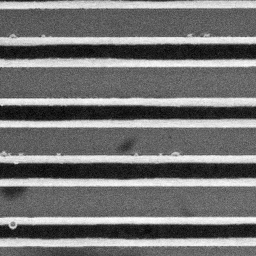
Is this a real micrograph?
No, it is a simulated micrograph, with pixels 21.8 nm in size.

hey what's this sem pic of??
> lines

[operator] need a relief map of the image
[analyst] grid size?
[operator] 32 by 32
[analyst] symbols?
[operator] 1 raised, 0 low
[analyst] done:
11111111111111111111111111110001
00000000000000000000000000000000
00000000000000000000000000000000
00000000000000000000000000000000
00000000000000000000000000000000
11111111111111111111111111111111
11111111111111111111111111111111
11111111111111111111111111111111
00000000000000000000000000000000
00000000000000000000000000000000
00000000000000000000000000000000
00000000000000000000000000000000
00000000000000000000000000000000
11111111111111111111111111111111
11111111111111111111111111111111
11111111111111111001000110000000
00000000000000000000000000000000
00000000000000000000000000000000
00000000000000000000000000000000
00000000000000000000000000000000
11111111111111111111111111111111
11111111111111111111111111111111
11111111111111111111111111111111
00000000000000000000000000000000
00000000000000000000000000000000
00000000000000000000000000000000
00000000000000000000000000000000
00000000000000000000000000000000
11111111111111111111111111111111
11111111111111111111111111111111
00000000000000000000000000000000
00000000000000000000000000000000